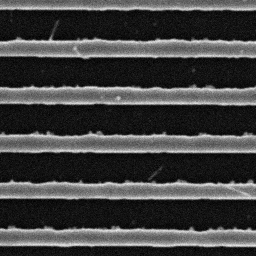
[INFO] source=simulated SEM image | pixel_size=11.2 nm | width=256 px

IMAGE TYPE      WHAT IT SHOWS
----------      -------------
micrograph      lines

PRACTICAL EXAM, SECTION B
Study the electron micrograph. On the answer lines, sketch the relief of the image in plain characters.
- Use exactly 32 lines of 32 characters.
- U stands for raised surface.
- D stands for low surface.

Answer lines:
UUUUUUUUUUUUUUUUUUUUUUUUUUUUUUUU
DDDDDDDDDDDDDDDDDDDDDDDDDDDDDDDD
DDDDDDDDDDDDDDDDDDDDDDDDDDDDDDDD
DDDDDDDDDDDDDDDDDDDDDDDDDDDDDDDD
DDDDDDDDDDDDDDDDDDDDDDDDDDDDDDDD
UUUUUUUUUUUUUUUUUUUUUUUUUUUUUUUU
UUUUUUUUUUUUUUUUUUUUUUUUUUUUUUUU
DDDDDDDDDDDDDDDDDDDDDDDDDDDDDDDD
DDDDDDDDDDDDDDDDDDDDDDDDDDDDDDDD
DDDDDDDDDDDDDDDDDDDDDDDDDDDDDDDD
DDDDDDDDDDDDDDDDDDDDDDDDDDDDDDDD
UUUUUUUUUUUUUUUUUUUUUUUUUUUUUUUU
UUUUUUUUUUUUUUUUUUUUUUUUUUUUUUUU
DDDDDDDDDDDDDDDDDDDDDDDDDDDDDDDD
DDDDDDDDDDDDDDDDDDDDDDDDDDDDDDDD
DDDDDDDDDDDDDDDDDDDDDDDDDDDDDDDD
DDDDDDDDDDDDDDDDDDDDDDDDDDDDDDDD
UUUUUUUUUUUUUUUUUUUUUUUUUUUUUUUU
UUUUUUUUUUUUUUUUUUUUUUUUUUUUUUUU
DDDDDDDDDDDDDDDDDDDDDDDDDDDDDDDD
DDDDDDDDDDDDDDDDDDDDDDDDDDDDDDDD
DDDDDDDDDDDDDDDDDDDDDDDDDDDDDDDD
DDDDDDDDDDDDDDDDDDDDDDDDDDDDDDDD
UUUUUUUUUUUUUUUUUUUUUUUUUUUUUUUU
UUUUUUUUUUUUUUUUUUUUUUUUUUUUUUUU
DDDDDDDDDDDDDDDDDDDDDDDDDDDDDDDD
DDDDDDDDDDDDDDDDDDDDDDDDDDDDDDDD
DDDDDDDDDDDDDDDDDDDDDDDDDDDDDDDD
DDDDDDDDDDDDDDDDDDDDDDDDDDDDDDDD
UUUUUUUUUUUUUUUUUUUUUUUUUUUUUUUU
UUUUUUUUUUUUUUUUUUUUUUUUUUUUUUUU
DDDDDDDDDDDDDDDDDDDDDDDDDDDDDDDD